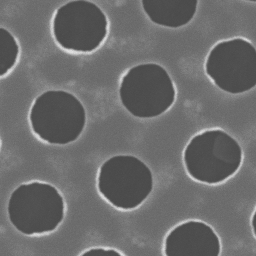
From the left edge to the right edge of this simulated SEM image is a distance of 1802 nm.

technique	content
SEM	holes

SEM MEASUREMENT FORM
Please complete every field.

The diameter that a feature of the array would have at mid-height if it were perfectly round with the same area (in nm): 380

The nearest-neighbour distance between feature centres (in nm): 654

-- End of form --